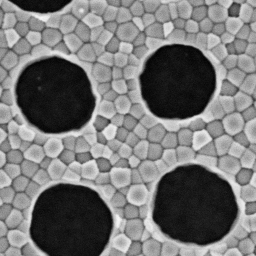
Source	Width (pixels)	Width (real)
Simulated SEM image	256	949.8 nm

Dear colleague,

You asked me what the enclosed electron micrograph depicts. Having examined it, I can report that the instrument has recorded holes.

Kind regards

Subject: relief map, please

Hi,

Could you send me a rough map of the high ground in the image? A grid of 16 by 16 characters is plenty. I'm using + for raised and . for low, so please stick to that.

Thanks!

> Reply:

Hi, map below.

+...++++++++++++
++++++++++++++++
++++++++++++++++
+++++++++....+++
+....++++....+++
+.....+++....+++
+.....+++....+++
++....++++++++++
++++++++++++++++
++++++++++++++++
+++++++++++..+++
++++++++++....++
++....++++.....+
++.....+++.....+
++.....+++....++
++.....+++++++++